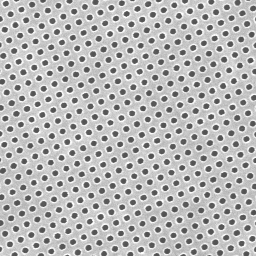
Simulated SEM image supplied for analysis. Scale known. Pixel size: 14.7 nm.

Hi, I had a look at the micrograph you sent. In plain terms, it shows a regular array of holes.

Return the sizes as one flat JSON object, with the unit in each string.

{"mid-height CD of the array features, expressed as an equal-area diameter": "94 nanometres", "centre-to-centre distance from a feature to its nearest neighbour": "170 nm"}